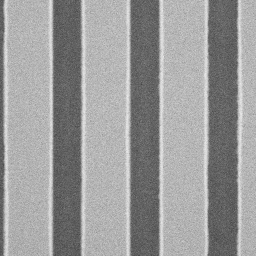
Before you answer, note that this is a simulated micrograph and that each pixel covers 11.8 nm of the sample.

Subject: lines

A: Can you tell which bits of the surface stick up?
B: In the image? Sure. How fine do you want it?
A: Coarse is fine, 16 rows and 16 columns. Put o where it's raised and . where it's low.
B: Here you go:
ooo..ooo..ooo..o
ooo..ooo..ooo..o
ooo..ooo..ooo..o
ooo..ooo..ooo..o
ooo..ooo..ooo..o
ooo..ooo..ooo..o
ooo..ooo..ooo..o
ooo..ooo..ooo..o
ooo..ooo..ooo..o
ooo..ooo..ooo..o
ooo..ooo..ooo..o
ooo..ooo..ooo..o
ooo..ooo..ooo..o
ooo..ooo..ooo..o
ooo..ooo..ooo..o
ooo..ooo..ooo..o